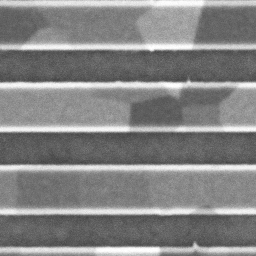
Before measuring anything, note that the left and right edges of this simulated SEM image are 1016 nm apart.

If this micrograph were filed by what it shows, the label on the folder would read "one or a few lines or trenches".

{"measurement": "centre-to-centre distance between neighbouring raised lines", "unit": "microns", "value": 0.327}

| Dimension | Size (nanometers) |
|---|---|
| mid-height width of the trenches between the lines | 146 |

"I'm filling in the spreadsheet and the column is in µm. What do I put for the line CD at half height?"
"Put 0.179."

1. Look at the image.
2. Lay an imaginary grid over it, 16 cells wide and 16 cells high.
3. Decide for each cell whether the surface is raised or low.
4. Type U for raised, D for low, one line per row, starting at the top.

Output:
UUUUUUUUUUUUUUUU
UUUUUUUUUUUUUUUU
UUUUUUUUUUUUUUUU
DDDDDDDDDDDDDDDD
DDDDDDDDDDDDDDDD
UUUUUUUUUUUUUUUU
UUUUUUUUUUUUUUUU
UUUUUUUUUUUUUUUU
DDDDDDDDDDDDDDDD
DDDDDDDDDDDDDDDD
UUUUUUUUUUUUUUUU
UUUUUUUUUUUUUUUU
UUUUUUUUUUUUUUUU
DDDDDDDDDDDDDDDD
DDDDDDDDDDDDDDDD
DDDDDDDDDDDDDDDD